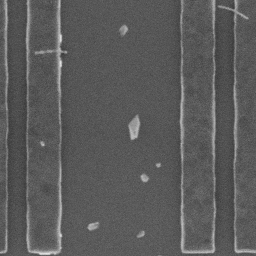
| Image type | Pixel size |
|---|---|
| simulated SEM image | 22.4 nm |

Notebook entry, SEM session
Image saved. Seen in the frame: wiring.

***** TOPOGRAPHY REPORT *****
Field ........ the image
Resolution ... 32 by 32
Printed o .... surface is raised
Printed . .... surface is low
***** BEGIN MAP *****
o...ooo................oooo..ooo
o...ooo................oooo..ooo
o...ooo................oooo..ooo
o..oooo................oooo..ooo
o..oooo................oooo..ooo
o..oooo................oooo..ooo
o..ooooo...............oooo..ooo
o..oooo................oooo..ooo
o..oooo................oooo..ooo
o..oooo................oooo..ooo
o..oooo................oooo..ooo
o..ooooo...............oooo..ooo
o..ooooo...............oooo..ooo
o...oooo...............oooo..ooo
o...oooo...............oooo..ooo
o..ooooo...............oooo..ooo
o..ooooo........o......oooo..ooo
o..ooooo...............oooo..ooo
o..ooooo...............oooo..ooo
o..ooooo...............oooo..ooo
o..ooooo...............oooo..ooo
o..ooooo...............oooo..ooo
o..ooooo...............oooo..ooo
o..ooooo...............oooo..ooo
o..ooooo...............oooo..ooo
o..ooooo...............oooo..ooo
o..ooooo...............oooo..ooo
o..ooooo...............oooo..ooo
o..oooo................oooo..ooo
o..oooo................oooo..ooo
o..oooo................oooo..ooo
....oo.................ooo......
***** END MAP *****